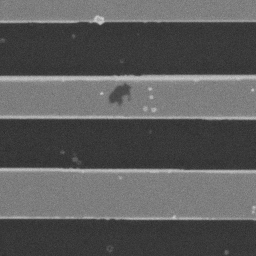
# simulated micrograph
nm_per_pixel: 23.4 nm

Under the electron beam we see lines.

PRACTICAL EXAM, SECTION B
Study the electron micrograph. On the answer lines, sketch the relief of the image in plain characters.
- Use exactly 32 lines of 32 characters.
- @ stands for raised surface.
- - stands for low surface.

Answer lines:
@@@@@@@@@@@@@@@@@@@@@@@@@@@@@@@@
@@@@@@@@@@@@@@@@@@@@@@@@@@@@@@@@
@@@@@@@@@@@@@@@@@@@@@@@@@@@@@@@@
--------------------------------
--------------------------------
--------------------------------
--------------------------------
--------------------------------
--------------------------------
-----------------------------@@@
@@@@@@@@@@@@@@@@@@@@@@@@@@@@@@@@
@@@@@@@@@@@@@@@@@@@@@@@@@@@@@@@@
@@@@@@@@@@@@@@@@@@@@@@@@@@@@@@@@
@@@@@@@@@@@@@@@@@@@@@@@@@@@@@@@@
@@@@@@@@@@@@@@@@@@@@@@@@@@@@@@@@
--------------------------------
--------------------------------
--------------------------------
--------------------------------
--------------------------------
--------------------------------
@@@@@@@@@@@@@@@@@@@@@@@@@@@@@@@@
@@@@@@@@@@@@@@@@@@@@@@@@@@@@@@@@
@@@@@@@@@@@@@@@@@@@@@@@@@@@@@@@@
@@@@@@@@@@@@@@@@@@@@@@@@@@@@@@@@
@@@@@@@@@@@@@@@@@@@@@@@@@@@@@@@@
@@@@@@@@@@@@@@@@@@@@@@@@@@@@@@@@
-------------------------------@
--------------------------------
--------------------------------
--------------------------------
--------------------------------